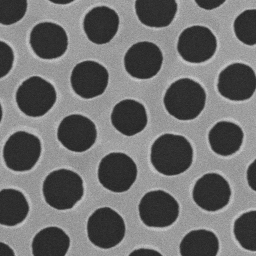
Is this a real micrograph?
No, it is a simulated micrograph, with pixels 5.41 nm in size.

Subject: a regular array of holes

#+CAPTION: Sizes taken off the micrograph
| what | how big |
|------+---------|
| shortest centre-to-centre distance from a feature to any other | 299 nm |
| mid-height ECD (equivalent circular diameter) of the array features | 218 nm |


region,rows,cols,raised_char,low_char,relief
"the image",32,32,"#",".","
...####..########.....###...####
...########...###.....########..
...#######.....##.....#######...
####....##.....####.###...###...
####....###...########.....###..
.###.....###.####..###.....####.
..##....########....##.....#####
..#############.....###...######
..#######....##.....########...#
.########.....##...########.....
###...###....########....##.....
##.....##....########.....#.....
##.....########..###......##...#
##....########....###.....######
####.###...###....####...#######
#######.....##....#########...##
##..###.....###..#########....##
#....##.....#######.....##.....#
.....###...########.....##....##
.....########...###.....####.###
#...########.....##.....#######.
##.###...###.....###...###.####.
#####.....##.....#######....###.
#####......##...########.....##.
...##.....########...###.....###
....##....#######.....###....###
....########...##.....####.####.
...########....###....#######...
######..###.....###..########...
####.....##.....#######....##...
.###.....###...#######.....###..
..##....########....##.....#####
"